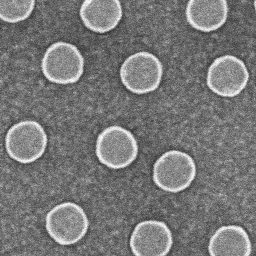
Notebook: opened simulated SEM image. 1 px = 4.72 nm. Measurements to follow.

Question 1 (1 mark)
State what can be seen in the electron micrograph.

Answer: raised bodies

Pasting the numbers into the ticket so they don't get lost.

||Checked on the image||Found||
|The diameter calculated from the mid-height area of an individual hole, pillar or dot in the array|188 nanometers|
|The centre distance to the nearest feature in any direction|0.373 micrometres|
